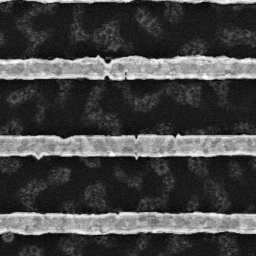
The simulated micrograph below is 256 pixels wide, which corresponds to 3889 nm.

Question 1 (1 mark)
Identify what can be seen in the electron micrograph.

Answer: one or a few lines or trenches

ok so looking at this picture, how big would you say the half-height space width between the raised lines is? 912 nanometres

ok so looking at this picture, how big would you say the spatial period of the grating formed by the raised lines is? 1.18 um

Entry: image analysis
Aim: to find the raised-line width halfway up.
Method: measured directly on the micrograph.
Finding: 268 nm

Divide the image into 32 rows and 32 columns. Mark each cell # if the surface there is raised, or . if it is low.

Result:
................................
................................
................................
................................
................................
................................
................................
....#..##.###..######.########..
################################
#############.################.#
................................
................................
................................
................................
................................
................................
................................
################################
################################
....#............#..............
................................
................................
................................
................................
................................
................................
................................
################################
################################
................................
................................
................................